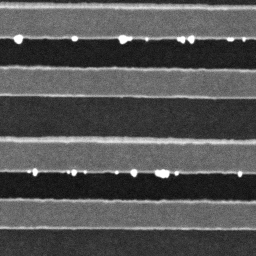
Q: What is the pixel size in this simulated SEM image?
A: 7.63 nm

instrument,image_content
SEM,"lines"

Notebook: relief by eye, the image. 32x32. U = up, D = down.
DDDDDDDDDDDDDDDDDDDDDDDDDDDDDDDD
UUUUUUUUUUUUUUUUUUUUUUUUUUUUUUUU
UUUUUUUUUUUUUUUUUUUUUUUUUUUUUUUU
UUUUUUUUUUUUUUUUUUUUUUUUUUUUUUUU
UUUUUUUUUUUUUUUUUUUUUUUUUUUUUUUU
DDDDDDDDDDDDDDDDDDDDDDDDDDDDDDDD
DDDDDDDDDDDDDDDDDDDDDDDDDDDDDDDD
DDDDDDDDDDDDDDDDDDDDDDDDDDDDDDDD
UUUUUUUDDDDDDDUDDDDDDDDDDDDDDDDD
UUUUUUUUUUUUUUUUUUUUUUUUUUUUUUUU
UUUUUUUUUUUUUUUUUUUUUUUUUUUUUUUU
UUUUUUUUUUUUUUUUUUUUUUUUUUUUUUUU
DDDDDDDDDDDDDDDDDDDDDDDDDDDDDDDD
DDDDDDDDDDDDDDDDDDDDDDDDDDDDDDDD
DDDDDDDDDDDDDDDDDDDDDDDDDDDDDDDD
DDDDDDDDDDDDDDDDDDDDDDDDDDDDDDDD
DDDDDDDDDDDDDDDDDDDDDDDDDDDDDDDD
UUUUUUUUUUUUDDDDDDDDDDDDDDDDDDDD
UUUUUUUUUUUUUUUUUUUUUUUUUUUUUUUU
UUUUUUUUUUUUUUUUUUUUUUUUUUUUUUUU
UUUUUUUUUUUUUUUUUUUUUUUUUUUUUUUU
DDDUUDDUUUUDDDUDUUDUUUUUUUUUUUUU
DDDDDDDDDDDDDDDDDDDDDDDDDDDDDDDD
DDDDDDDDDDDDDDDDDDDDDDDDDDDDDDDD
DDDDDDDDDDDDDDDDDDDDDDDDDDDDDDDD
UUUUUUUUUUUUUUUUUUUUUUUUUUUUUUUU
UUUUUUUUUUUUUUUUUUUUUUUUUUUUUUUU
UUUUUUUUUUUUUUUUUUUUUUUUUUUUUUUU
UUUUUUUUUUUUUUUUUUUUUUUUUUUUUUUU
DDDDDDDDDDDDDDDDDDDDDDDDDDDDDDDD
DDDDDDDDDDDDDDDDDDDDDDDDDDDDDDDD
DDDDDDDDDDDDDDDDDDDDDDDDDDDDDDDD